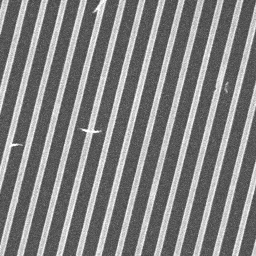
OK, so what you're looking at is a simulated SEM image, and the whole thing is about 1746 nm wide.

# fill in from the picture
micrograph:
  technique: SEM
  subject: parallel lines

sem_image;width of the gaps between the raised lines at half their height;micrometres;0.0927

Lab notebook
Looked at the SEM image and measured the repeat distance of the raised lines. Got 129 nanometers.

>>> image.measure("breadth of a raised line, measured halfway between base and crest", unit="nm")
33.1